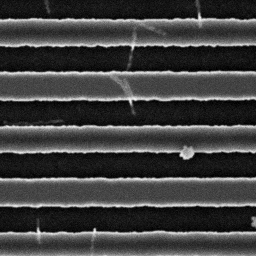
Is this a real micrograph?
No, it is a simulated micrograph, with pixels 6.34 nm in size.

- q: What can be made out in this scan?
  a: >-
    lines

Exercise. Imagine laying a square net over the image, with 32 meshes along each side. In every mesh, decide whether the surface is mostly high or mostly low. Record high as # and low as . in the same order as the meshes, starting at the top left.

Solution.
................................
................................
#################.##############
################################
################################
################################
................................
................................
................................
################################
################################
################################
#########...###.#...#...........
................................
................................
................................
################################
################################
################################
.......................#........
................................
................................
################################
################################
################################
################################
................................
................................
................................
################################
################################
################################